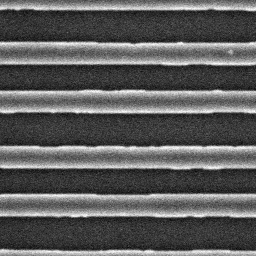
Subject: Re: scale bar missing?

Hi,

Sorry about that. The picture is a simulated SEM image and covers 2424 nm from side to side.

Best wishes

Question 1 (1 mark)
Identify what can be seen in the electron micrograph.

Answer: lines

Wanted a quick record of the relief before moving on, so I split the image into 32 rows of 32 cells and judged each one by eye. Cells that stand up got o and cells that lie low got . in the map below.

oooooooooooooooooooooooooooooooo
................................
................................
................................
................................
oooooooooooooooooooooooooooooooo
oooooooooooooooooooooooooooooooo
oooooooooooooooooooooooooooooooo
................................
................................
................................
oooooooooooooooooooooooooooooooo
oooooooooooooooooooooooooooooooo
oooooooooooooooooooooooooooooooo
................................
................................
................................
................................
oooooooooooooooooooooooooooooooo
oooooooooooooooooooooooooooooooo
oooooooooooooooooooooooooooooooo
................................
................................
................................
oooooooooooooooooooooooooooooooo
oooooooooooooooooooooooooooooooo
oooooooooooooooooooooooooooooooo
................................
................................
................................
................................
oooooooooooooooooooooooooooooooo